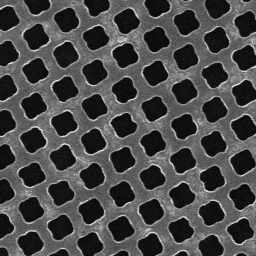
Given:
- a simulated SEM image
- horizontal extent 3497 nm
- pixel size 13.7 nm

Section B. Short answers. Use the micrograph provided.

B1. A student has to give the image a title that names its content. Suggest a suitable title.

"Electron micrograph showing a regular array of holes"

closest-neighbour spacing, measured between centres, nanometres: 466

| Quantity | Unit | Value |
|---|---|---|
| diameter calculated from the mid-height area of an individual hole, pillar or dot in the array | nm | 326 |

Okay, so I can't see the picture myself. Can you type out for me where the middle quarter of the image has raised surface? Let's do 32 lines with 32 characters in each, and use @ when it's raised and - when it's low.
-@@@@-----@@@@--@@@@@----@@@----
@@@@@------@@@@@@@@@-----@@@@@@@
@@@@@------@@@@@@@@@------@@@@@@
--@@@-----@@@@@-@@@@------@@@@@@
--@@@@---@@@@----@@@@----@@@@---
---@@@@@@@@@-----@@@@@-@@@@-----
----@@@@@@@@------@@@@@@@@@-----
----@@@@@@@@------@@@@@@@@@-----
--@@@@----@@@-----@@@@--@@@@----
@@@@@-----@@@@--@@@@-----@@@---@
@@@@-------@@@@@@@@------@@@@@@@
@@@@@------@@@@@@@@-------@@@@@@
--@@@@----@@@@@-@@@@------@@@@@@
--@@@@--@@@@-----@@@@---@@@@----
---@@@@@@@@@------@@@-@@@@@-----
---@@@@@@@@@------@@@@@@@@@-----
---@@@@--@@@@-----@@@@@@@@@-----
-@@@@----@@@@----@@@@---@@@@----
@@@@------@@@@-@@@@------@@@--@@
@@@@------@@@@@@@@@------@@@@@@@
-@@@@-----@@@@@@@@@@-----@@@@@@@
--@@@----@@@@@---@@@-----@@@@---
--@@@@-@@@@@-----@@@@--@@@@-----
---@@@@@@@@@------@@@@@@@@@-----
---@@@@@@@@@------@@@@@@@@@-----
--@@@@---@@@-----@@@@@-@@@@-----
@@@@------@@@---@@@@----@@@@---@
@@@@------@@@@@@@@@------@@@@@@@
@@@@------@@@@@@@@@------@@@@@@@
-@@@@-----@@@@--@@@@-----@@@@@@@
-@@@@---@@@@@----@@@----@@@@---@
--@@@@@@@@@------@@@@@@@@@@-----